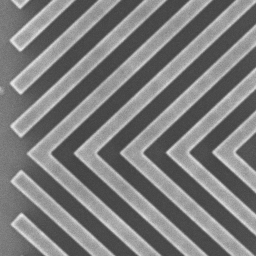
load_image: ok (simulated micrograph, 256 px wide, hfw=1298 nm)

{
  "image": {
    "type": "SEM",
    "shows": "groups of lines, slits or small figures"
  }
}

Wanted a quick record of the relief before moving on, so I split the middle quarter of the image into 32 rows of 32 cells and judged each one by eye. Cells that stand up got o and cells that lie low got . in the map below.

...ooooo......oooooo......ooooo.
..ooooo......oooooo.....oooooo..
oooooo......ooooo......oooooo...
ooooo......ooooo......oooooo....
oooo......ooooo......oooooo.....
ooo......oooooo.....oooooo......
oo......ooooo......oooooo......o
o......ooooo......oooooo.....ooo
.....oooooo......ooooo......oooo
....oooooo......oooooo.....ooooo
...oooooo......oooooo.....oooooo
..oooooo......oooooo.....oooooo.
.oooooo......ooooo......oooooo..
oooooo......ooooo......oooooo...
ooooo......ooooo......oooooo....
oooo.....oooooo......oooooo.....
ooo......ooooo......oooooo.....o
oo.....oooooo......oooooo.....oo
o.....oooooo......ooooo......ooo
.....oooooo......ooooo......oooo
....oooooo......oooooo.....ooooo
...oooooo......ooooo......oooooo
...ooooo......oooooo......oooooo
...oooooo......oooooo......ooooo
.....ooooo......oooooo......oooo
......ooooo......oooooo......ooo
o......oooooo.....oooooo......oo
oo......oooooo......ooooo......o
ooo......oooooo......oooooo.....
oooo......oooooo......oooooo....
ooooo......oooooo......ooooo....
.ooooo......oooooo......oooooo..